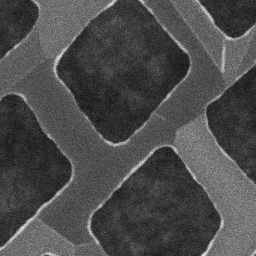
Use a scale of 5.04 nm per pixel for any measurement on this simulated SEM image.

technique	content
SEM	holes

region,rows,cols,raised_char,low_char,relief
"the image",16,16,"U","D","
DDUUUUUDDUUUUDDD
DDUUUDDDDDUUUDDD
DUUUUDDDDDDUUUUU
UUUUDDDDDDDDUUUU
UUUUDDDDDDDDUUUD
UUUUDDDDDDDUUUDD
DDUUUDDDDDUUUDDD
DDUUUUDDDUUUUDDD
DDDUUUDDUUUUUDDD
DDDDUUUUUUDUUUDD
DDDDUUUUUDDDUUUD
DDDDUUUUDDDDUUUU
DDDUUUUDDDDDDUUU
DDUUUUDDDDDDDDUU
DUUUUUDDDDDDDDUU
UUUUUUDDDDDDDUUU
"